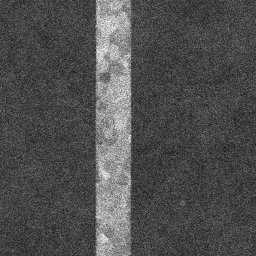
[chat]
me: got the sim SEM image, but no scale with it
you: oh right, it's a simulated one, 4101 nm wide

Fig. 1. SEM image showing one or a few lines or trenches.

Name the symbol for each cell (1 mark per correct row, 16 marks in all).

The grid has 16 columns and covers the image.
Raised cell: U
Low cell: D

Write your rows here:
DDDDDDUUDDDDDDDD
DDDDDDUUDDDDDDDD
DDDDDDUUDDDDDDDD
DDDDDDUUDDDDDDDD
DDDDDDUUDDDDDDDD
DDDDDDUUDDDDDDDD
DDDDDDUUDDDDDDDD
DDDDDDUUDDDDDDDD
DDDDDDUUDDDDDDDD
DDDDDDUUDDDDDDDD
DDDDDDUUDDDDDDDD
DDDDDDUUDDDDDDDD
DDDDDDUUDDDDDDDD
DDDDDDUUDDDDDDDD
DDDDDDUUDDDDDDDD
DDDDDDUUDDDDDDDD